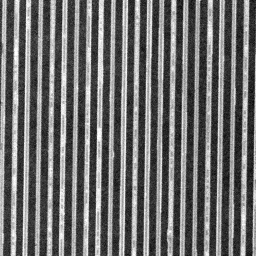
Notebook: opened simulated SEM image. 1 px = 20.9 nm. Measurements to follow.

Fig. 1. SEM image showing parallel lines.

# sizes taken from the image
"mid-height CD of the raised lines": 73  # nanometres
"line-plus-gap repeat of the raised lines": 12.1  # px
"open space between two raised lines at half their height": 175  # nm